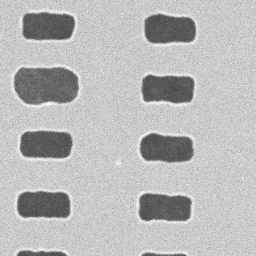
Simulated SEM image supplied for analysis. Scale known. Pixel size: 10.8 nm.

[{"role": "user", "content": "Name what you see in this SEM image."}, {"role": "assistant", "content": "a regular array of holes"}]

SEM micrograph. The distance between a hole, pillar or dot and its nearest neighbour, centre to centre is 642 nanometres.